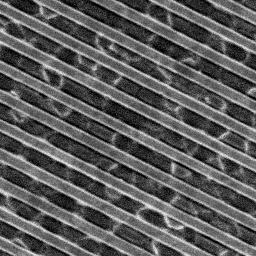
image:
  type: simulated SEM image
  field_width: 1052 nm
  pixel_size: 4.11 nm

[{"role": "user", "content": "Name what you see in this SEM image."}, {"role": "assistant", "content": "parallel lines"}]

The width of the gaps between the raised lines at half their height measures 64.6 nanometers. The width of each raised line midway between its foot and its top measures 0.0403 microns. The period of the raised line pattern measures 108 nanometers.